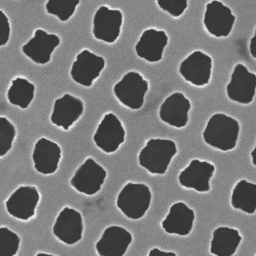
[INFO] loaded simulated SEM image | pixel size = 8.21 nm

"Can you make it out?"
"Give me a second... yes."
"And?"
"a regular array of holes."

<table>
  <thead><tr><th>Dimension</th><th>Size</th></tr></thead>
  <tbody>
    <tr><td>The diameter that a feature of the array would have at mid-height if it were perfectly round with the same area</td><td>258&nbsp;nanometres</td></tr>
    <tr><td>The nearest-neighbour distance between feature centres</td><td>48.2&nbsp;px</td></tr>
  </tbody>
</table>